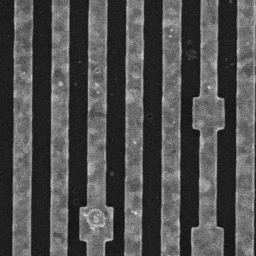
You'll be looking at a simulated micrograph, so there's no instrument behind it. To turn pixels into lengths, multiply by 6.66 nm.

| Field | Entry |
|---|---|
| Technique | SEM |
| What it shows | wiring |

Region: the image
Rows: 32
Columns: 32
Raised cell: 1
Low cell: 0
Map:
00110001100110001100111001100011
00110001100110001100111001100011
00110001100110001100111001100011
00110001100110001100111001100011
00110001100110001100111001100011
00110001100110001100111001100011
00110001100110001100111001100011
00110001100110001100111001100011
00110001100110001100110001100011
00110001100110001100111001100011
00110001100110001100111001100011
00110001100110001100110001100011
00110001100110001100110011110011
00110001100110001100110011110011
00110001100110001100110011110011
00110001100110001100110011110011
00110001100110001100110001100011
00110011100110001100110001100011
00110011100110001100110001100011
00110011100110001100110001100011
00110011100110001100110001100011
00110011100110001100110001100011
00110011000110001100110001100011
00110011000110001100110001100011
00110011000110001100110001100011
00110011000110001100110001100011
00110011001111001100110001100011
00110011001111001100110001100011
00110011001111001100110011110011
00110011001111001100110011110011
00110011000110001100110011110011
00110011000110001100110011110011